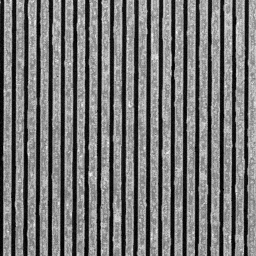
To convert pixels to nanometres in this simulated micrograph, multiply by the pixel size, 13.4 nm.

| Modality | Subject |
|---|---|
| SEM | parallel lines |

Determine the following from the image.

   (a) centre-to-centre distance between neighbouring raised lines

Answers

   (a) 164 nanometres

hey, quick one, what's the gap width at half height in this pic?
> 63.8 nanometres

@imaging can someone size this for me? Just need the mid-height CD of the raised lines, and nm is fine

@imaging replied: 101